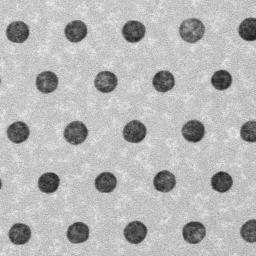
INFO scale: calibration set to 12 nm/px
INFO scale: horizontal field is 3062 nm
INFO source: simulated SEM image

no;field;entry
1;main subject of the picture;a regular array of holes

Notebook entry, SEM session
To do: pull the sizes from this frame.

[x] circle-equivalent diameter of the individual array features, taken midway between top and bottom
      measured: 270 nm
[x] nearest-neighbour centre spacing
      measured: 689 nanometers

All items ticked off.